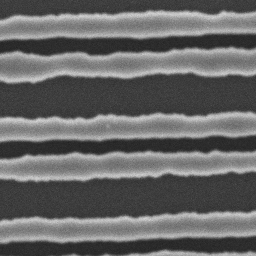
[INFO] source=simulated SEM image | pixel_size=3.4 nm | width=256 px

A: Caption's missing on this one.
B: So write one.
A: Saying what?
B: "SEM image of lines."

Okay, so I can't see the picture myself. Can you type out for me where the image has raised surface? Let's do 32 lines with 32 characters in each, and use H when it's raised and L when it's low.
LLLLLLLLLLLLLLLLLLLLLLLLLLLLLLLL
LLLLLLLLLLLLLLLLLLHHHLLHLLLLLLLL
HHHHHHHHHHHHHHHHHHHHHHHHHHHHHHHH
HHHHHHHHHHHHHHHHHHHHHHHHHHHHHHHH
HHHHHHHHHHHHHHHHHHHHHLLLLLLLLLLL
LLLLLLLLLLLLLLLLLLLLLLLLLLLLLLLL
LLHLLLLLLLLLLLLLLLHLLHHHHHHHHHHH
HHHHHHHHHHHHHHHHHHHHHHHHHHHHHHHH
HHHHHHHHHHHHHHHHHHHHHHHHHHHHHHHH
HHHHHHHLLHHHHHHHHHLLLLLLLHHHLLLL
LLLLLLLLLLLLLLLLLLLLLLLLLLLLLLLL
LLLLLLLLLLLLLLLLLLLLLLLLLLLLLLLL
LLLLLLLLLLLLLLLLLLLLLLLLLLLLLLLL
LLLLLLLLLLLLLLLLLLLLLLLLLLLLLLLL
LLLLLLLLLLLLHHHHLHHHHHHHHHHHHHHH
HHHHHHHHHHHHHHHHHHHHHHHHHHHHHHHH
HHHHHHHHHHHHHHHHHHHHHHHHHHHHHHHH
HHHHHHHLLLHHHLLLLLLLLLLLLLLLLLLL
LLLLLLLLLLLLLLLLLLLLLLLLLLLLLLLL
LLLHHHHHHHHHHHHHHHHHHHHHHHHHHHHH
HHHHHHHHHHHHHHHHHHHHHHHHHHHHHHHH
HHHHHHHHHHHHHHHHHHHHHHHHHHHHHHHL
LLHHHHHHHHHLLLLLLLLLLLLLLLLLLLLL
LLLLLLLLLLLLLLLLLLLLLLLLLLLLLLLL
LLLLLLLLLLLLLLLLLLLLLLLLLLLLLLLL
LLLLLLLLLLLLLLLLLLLLLLLLLLLLLLLL
LLLLLLLLLLLLLLLLLLLLLLLLLLLLLLLL
HHHHHHHHHHHHHHHHHHHHHHHHHHHHHHHH
HHHHHHHHHHHHHHHHHHHHHHHHHHHHHHHH
HHHHHHHHHHHHHHHHHHHHHHHHHHHHHHHL
LLLLLLLLLLLLLLLLLLLLLLLLLLLLLLLL
LLLLLLLLLLLLLLLLLLLHHHHHHLLLHLLH